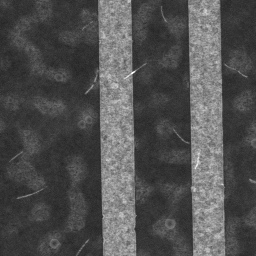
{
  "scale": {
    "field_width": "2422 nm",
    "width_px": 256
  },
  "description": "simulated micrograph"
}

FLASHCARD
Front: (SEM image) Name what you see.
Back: one or a few lines or trenches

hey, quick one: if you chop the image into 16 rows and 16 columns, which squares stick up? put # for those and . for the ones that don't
......##....##..
......##....##..
......##....##..
......##....##..
......##....##..
......##....##..
......##....##..
......##....##..
......##....##..
......##....##..
......##....##..
......##....##..
......###...##..
......##....##..
......##....##..
......##....##..